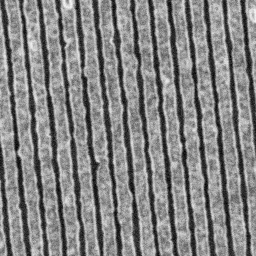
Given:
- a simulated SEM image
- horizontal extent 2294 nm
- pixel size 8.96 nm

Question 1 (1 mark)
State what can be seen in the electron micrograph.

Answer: parallel lines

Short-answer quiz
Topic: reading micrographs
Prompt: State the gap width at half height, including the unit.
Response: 56.8 nm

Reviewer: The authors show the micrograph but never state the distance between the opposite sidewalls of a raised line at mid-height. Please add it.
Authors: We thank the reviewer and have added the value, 105 nanometers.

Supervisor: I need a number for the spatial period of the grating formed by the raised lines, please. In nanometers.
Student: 165